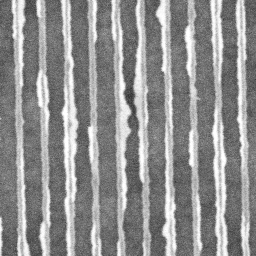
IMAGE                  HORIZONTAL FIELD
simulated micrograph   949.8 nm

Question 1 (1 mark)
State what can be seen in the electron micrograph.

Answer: parallel lines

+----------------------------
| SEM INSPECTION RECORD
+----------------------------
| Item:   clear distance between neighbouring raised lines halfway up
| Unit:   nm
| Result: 62.2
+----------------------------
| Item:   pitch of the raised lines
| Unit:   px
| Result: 24.8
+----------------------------